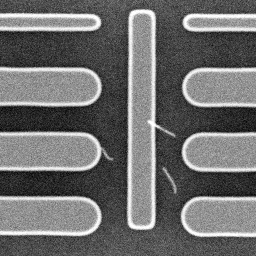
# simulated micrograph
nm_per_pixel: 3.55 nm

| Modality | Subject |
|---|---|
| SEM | groups of lines, slits or small figures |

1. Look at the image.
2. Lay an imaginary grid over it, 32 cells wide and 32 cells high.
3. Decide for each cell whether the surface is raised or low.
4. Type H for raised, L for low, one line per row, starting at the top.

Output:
LLLLLLLLLLLLLLLLLLLLLLLLLLLLLLLL
LLLLLLLLLLLLLLLLLHHLLLLLLLLLLLLL
HHHHHHHHHHHHLLLLHHHLLLLHHHHHHHHH
HHHHHHHHHHHHLLLLHHHLLLLHHHHHHHHH
LLLLLLLLLLLLLLLLHHHLLLLLLLLLLLLL
LLLLLLLLLLLLLLLLHHHLLLLLLLLLLLLL
LLLLLLLLLLLLLLLLHHHLLLLLLLLLLLLL
LLLLLLLLLLLLLLLLHHHLLLLLLLLLLLLL
LLLLLLLLLLLLLLLLHHHLLLLLLLLLLLLL
HHHHHHHHHHHHLLLLHHHLLLLHHHHHHHHH
HHHHHHHHHHHHLLLLHHHLLLLHHHHHHHHH
HHHHHHHHHHHHLLLLHHHLLLLHHHHHHHHH
HHHHHHHHHHHHLLLLHHHLLLLLHHHHHHHH
LLLLLLLLLLLLLLLLHHHLLLLLLLLLLLLL
LLLLLLLLLLLLLLLLHHHLLLLLLLLLLLLL
LLLLLLLLLLLLLLLLHHHLLLLLLLLLLLLL
LLLLLLLLLLLLLLLLHHHLLLLLLLLLLLLL
HHHHHHHHHHHHLLLLHHHLLLLHHHHHHHHH
HHHHHHHHHHHHLLLLHHHLLLLHHHHHHHHH
HHHHHHHHHHHHLLLLHHHLLLLHHHHHHHHH
HHHHHHHHHHHHLLLLHHHLLLLHHHHHHHHH
LLLLLLLLLLLLLLLLHHHLLLLLLLLLLLLL
LLLLLLLLLLLLLLLLHHHLLLLLLLLLLLLL
LLLLLLLLLLLLLLLLHHHLLLLLLLLLLLLL
LLLLLLLLLLLLLLLLHHHLLLLLLLLLLLLL
HHHHHHHHHHHHLLLLHHHLLLLHHHHHHHHH
HHHHHHHHHHHHLLLLHHHLLLLHHHHHHHHH
HHHHHHHHHHHHLLLLHHHLLLLHHHHHHHHH
HHHHHHHHHHHHLLLLLHLLLLLHHHHHHHHH
LLLLLLLLLLLLLLLLLLLLLLLLLLLLLLLL
LLLLLLLLLLLLLLLLLLLLLLLLLLLLLLLL
LLLLLLLLLLLLLLLLLLLLLLLLLLLLLLLL